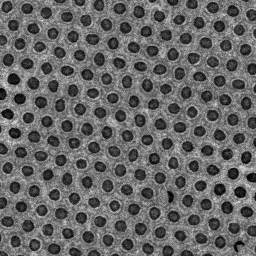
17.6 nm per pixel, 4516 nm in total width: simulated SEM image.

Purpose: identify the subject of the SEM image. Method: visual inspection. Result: a regular array of holes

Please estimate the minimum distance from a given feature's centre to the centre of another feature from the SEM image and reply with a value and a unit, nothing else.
343 nanometres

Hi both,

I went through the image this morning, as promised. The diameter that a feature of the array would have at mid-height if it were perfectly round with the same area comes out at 0.219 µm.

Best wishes